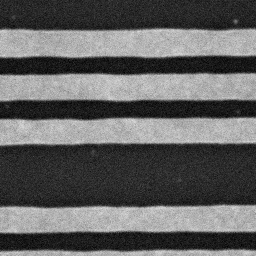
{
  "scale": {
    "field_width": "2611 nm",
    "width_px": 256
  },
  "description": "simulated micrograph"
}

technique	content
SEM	wiring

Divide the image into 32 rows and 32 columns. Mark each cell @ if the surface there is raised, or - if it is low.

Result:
--------------------------------
--------------------------------
--------------------------------
--------------------------------
@@@@@@@@@@@@@@@@@@@@@@@@@@@@@@@@
@@@@@@@@@@@@@@@@@@@@@@@@@@@@@@@@
@@@@@@@@@@@@@@@@@@@@@@@@@@@@@@@@
--------------------------------
--------------------------------
@@-@@@@@@@@@@@@@@@@@@@@@@@@@@@@@
@@@@@@@@@@@@@@@@@@@@@@@@@@@@@@@@
@@@@@@@@@@@@@@@@@@@@@@@@@@@@@@@@
@-------------@@@---------------
--------------------------------
--------------------------------
@@@@@@@@@@@@@@@@@@@@@@@@@@@@@@@@
@@@@@@@@@@@@@@@@@@@@@@@@@@@@@@@@
@@@@@@@@@@@@@@@@@@@@@@@@@@@@@@@@
--------------------------------
--------------------------------
--------------------------------
--------------------------------
--------------------------------
--------------------------------
--------------------------------
--------------------------------
@@@@@@@@@@@@@@@@@@@@@@@@@@@@@@@@
@@@@@@@@@@@@@@@@@@@@@@@@@@@@@@@@
@@@@@@@@@@@@@@@@@@@@@@@@@@@@@@@@
--------------------------------
--------------------------------
--@@@@@@----@@---@@@@@@@@@@@@@@@